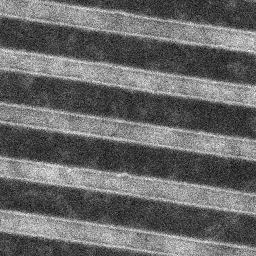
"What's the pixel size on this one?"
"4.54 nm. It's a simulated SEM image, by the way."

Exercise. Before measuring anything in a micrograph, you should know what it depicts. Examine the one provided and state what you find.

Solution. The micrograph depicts parallel lines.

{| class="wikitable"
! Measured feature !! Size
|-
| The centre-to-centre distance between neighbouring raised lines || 0.241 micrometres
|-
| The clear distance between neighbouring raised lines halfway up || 73.6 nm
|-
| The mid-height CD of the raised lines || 167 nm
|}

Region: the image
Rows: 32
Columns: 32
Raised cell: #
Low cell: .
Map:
......##########################
.............###################
#####..............#############
############...............#####
###################.............
#######################.##......
..##############################
........########################
#..............#################
#######..............###########
##############..............####
#####################...........
#####.########.#############....
...###########.#################
..........######################
###.............################
#########..............#########
################..............##
#######################.........
##############################..
.....###########################
............####################
#####..............#############
###########..............#######
###########.######..............
########################........
###############################.
.......#########################
..............##################
######...............#####.#####
#############..............#####
###################.............